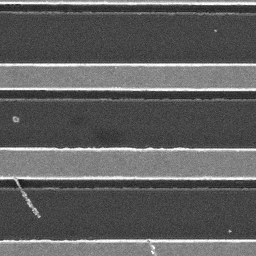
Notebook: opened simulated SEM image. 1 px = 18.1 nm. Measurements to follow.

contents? lines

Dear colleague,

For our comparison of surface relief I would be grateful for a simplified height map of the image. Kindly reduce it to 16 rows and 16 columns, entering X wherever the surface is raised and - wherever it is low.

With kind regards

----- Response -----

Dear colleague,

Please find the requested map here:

----------------
----------------
----------------
----------------
XXXXXXXXXXXXXXXX
XXXXXXXXXXXXXXXX
----------------
----------------
----------------
XXXXXXXXXXXXXXXX
XXXXXXXXXXXXXXXX
----------------
----------------
----------------
----------------
XXXXXXXXXXXXXXXX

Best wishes